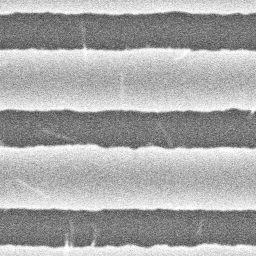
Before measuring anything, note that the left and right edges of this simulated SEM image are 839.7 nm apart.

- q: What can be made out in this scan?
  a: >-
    lines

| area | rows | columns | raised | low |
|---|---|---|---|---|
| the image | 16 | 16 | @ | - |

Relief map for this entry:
@@@@@@@@@@@@@@@@
----------------
----------------
@@@@@@@@@@@@@@@@
@@@@@@@@@@@@@@@@
@@@@@@@@@@@@@@@@
@@@@@@@@@@@@@@@@
----------------
----------------
@@@@@@@@@@@@@@@@
@@@@@@@@@@@@@@@@
@@@@@@@@@@@@@@@@
@@@@@@@@@@@@@@@@
----------------
----------------
@@@@@@@@@@@@@@@@